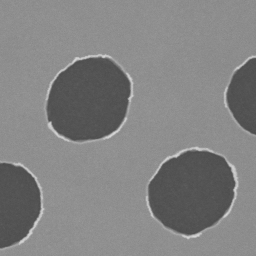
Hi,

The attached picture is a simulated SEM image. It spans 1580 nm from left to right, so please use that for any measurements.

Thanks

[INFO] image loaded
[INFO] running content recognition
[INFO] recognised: holes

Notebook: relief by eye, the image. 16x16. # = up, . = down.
################
################
################
################
####....#######.
###.....######..
###.....######..
###.....#######.
####...#########
############.###
.#########....##
..#######......#
...######......#
..########....##
..#########..###
################